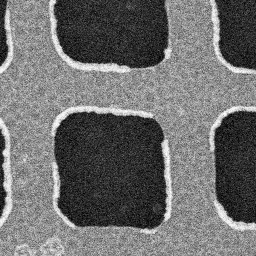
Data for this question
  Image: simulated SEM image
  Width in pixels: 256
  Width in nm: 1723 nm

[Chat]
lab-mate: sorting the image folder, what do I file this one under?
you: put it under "holes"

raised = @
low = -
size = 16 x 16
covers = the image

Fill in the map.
@@@-------@@@@--
@@@-------@@@@--
@@@@-------@@@--
@@@@------@@@@--
@@@@@@@@@@@@@@@@
@@@@@@@@@@@@@@@@
@@@@@@@@@@@@@@@@
@@@@------@@@@--
@@@-------@@@---
@@@-------@@@---
@@@@------@@@---
@@@@------@@@---
@@@@------@@@@--
@@@@------@@@@--
@@@@@@@@@@@@@@@@
@@@@@@@@@@@@@@@@